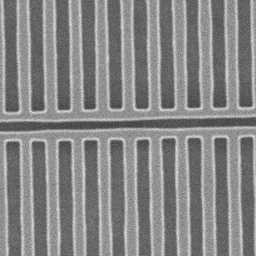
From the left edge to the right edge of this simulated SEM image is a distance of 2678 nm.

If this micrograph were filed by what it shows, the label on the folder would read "groups of lines, slits or small figures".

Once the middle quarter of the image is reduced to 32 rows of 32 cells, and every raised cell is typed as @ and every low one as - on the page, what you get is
--@@----@@@----@@----@@@----@@--
--@@----@@@----@@----@@@----@@--
--@@@---@@@----@@----@@@----@@--
--@@@---@@@----@@----@@@----@@--
--@@@---@@@----@@----@@@----@@--
--@@@---@@@----@@-----@@----@@--
--@@@---@@@----@@-----@@----@@--
--@@@---@@@----@@@----@@----@@--
--@@@---@@@----@@@----@@----@@--
--@@@---@@@----@@@----@@----@@--
--@@@---@@@----@@@----@@----@@--
-@@@@---@@@@@@@@@@@@@@@@@@@@@@@@
@@@@@@@@@@@@@@@@@@@@@@@@@@@@@@@@
@@@@@@@@@@@@@@@@@@@@@@@@--------
--------------------------------
--------------------------------
-------------@@@@@@@@@@@----@@@@
@@@@@@@@@@@@@@@@@@@@@@@@@@@@@@@@
@@@@@@@@@@@@@@@@@@@@@@@@@---@@@-
--@@@----@@----@@@----@@----@@@-
--@@@----@@----@@@----@@----@@@-
--@@@----@@----@@@----@@----@@@-
--@@@----@@----@@@----@@----@@@-
--@@@----@@----@@@----@@----@@@-
--@@@----@@----@@@----@@----@@@-
--@@@----@@----@@@----@@----@@@-
--@@@----@@----@@@----@@----@@@-
--@@@----@@----@@@----@@@---@@@-
--@@@----@@----@@@----@@@---@@@-
--@@@----@@----@@@----@@@---@@@-
--@@@----@@----@@@----@@@---@@@-
--@@@----@@----@@@----@@@---@@@-